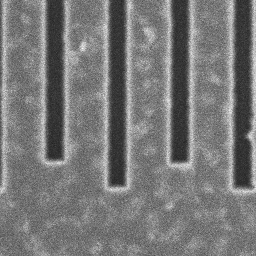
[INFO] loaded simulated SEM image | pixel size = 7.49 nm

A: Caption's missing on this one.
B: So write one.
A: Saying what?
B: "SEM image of parallel lines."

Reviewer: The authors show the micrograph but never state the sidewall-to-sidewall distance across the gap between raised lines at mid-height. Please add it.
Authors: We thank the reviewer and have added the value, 16.6 px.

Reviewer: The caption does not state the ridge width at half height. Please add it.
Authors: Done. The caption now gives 345 nm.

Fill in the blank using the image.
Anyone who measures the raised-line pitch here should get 468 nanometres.